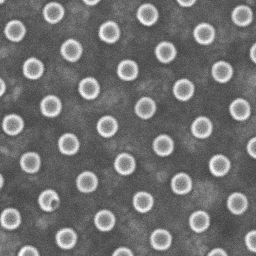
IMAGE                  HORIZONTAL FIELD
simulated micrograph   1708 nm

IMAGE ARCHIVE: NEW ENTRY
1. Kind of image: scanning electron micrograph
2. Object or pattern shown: a regular array of raised bodies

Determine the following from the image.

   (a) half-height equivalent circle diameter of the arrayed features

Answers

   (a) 132 nanometres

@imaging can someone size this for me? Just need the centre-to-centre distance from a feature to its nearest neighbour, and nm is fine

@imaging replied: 279